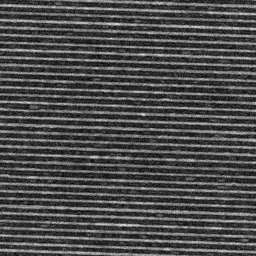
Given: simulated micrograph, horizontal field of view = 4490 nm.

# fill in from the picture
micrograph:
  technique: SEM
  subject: parallel lines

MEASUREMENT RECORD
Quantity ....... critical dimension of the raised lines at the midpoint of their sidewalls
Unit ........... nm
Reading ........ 37.2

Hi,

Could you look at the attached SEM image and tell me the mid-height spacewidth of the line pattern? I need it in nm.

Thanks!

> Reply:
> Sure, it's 98.6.